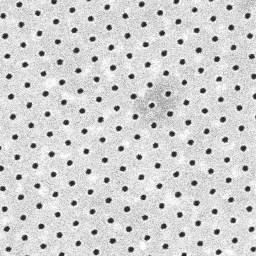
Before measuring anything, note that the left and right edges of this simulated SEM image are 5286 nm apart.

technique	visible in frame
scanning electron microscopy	a regular array of holes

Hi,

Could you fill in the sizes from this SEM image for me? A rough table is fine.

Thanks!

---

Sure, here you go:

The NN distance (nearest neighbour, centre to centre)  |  411 nm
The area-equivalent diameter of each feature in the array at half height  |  0.134 micrometres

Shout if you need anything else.